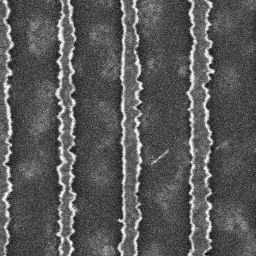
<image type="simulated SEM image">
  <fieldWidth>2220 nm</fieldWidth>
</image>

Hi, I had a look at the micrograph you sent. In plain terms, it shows one or a few lines or trenches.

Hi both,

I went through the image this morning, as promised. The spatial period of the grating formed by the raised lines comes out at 66.7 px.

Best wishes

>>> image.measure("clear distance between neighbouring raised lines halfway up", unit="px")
52.5